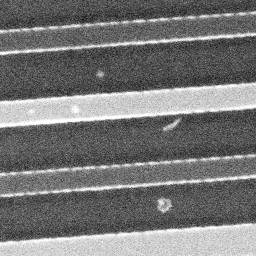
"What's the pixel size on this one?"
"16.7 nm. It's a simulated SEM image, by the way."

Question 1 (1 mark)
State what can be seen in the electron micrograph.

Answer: lines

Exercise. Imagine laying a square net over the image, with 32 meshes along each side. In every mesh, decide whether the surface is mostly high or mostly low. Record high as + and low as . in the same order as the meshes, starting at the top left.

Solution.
................................
................................
....................++++++++++++
......++++++++++++++++++++++++++
+++++++++++++++++++++++++++++...
++++++++++++++++................
++..............................
................................
................................
................................
...............................+
.................+++++++++++++++
....++++++++++++++++++++++++++++
+++++++++++++++++++++++++++++++.
++++++++++++++++++..............
+++.............................
................................
................................
................................
...............................+
.................+++++++++++++++
....++++++++++++++++++++++++++++
+++++++++++++++++++++++++++.....
++++++++++++++..................
................................
................................
................................
................................
.........................+++++++
...........+++++++++++++++++++++
++++++++++++++++++++++++++++++++
++++++++++++++++++++++++++++++++